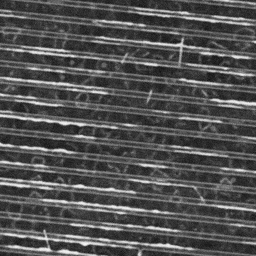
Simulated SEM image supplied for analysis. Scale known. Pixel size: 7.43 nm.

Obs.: parallel lines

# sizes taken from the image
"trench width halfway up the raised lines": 81.3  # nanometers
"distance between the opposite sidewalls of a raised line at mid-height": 43.5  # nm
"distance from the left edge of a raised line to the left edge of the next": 124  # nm